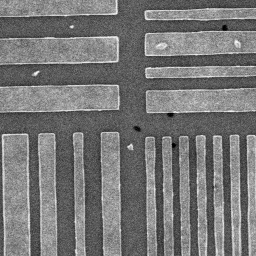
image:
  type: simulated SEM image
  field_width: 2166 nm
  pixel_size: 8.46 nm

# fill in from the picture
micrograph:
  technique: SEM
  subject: groups of lines, slits or small figures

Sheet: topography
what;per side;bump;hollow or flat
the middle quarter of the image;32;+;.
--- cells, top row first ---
................................
.....................+++++++++++
.....................+++++++++++
................................
................................
......+++++++...................
++++++++++++++..................
++++++++++++++.......+++++++++++
++++++++++++++.......+++++++++++
++++++++++++++.......+++++++++++
++++++++++++++.......+++++++++++
+++..................+++++++++++
................................
................................
................................
................................
................................
...++....+++++..................
...++....+++++.......+...+...++.
...++....+++++.......++..++..++.
...++....+++++..+....++..++..++.
...++....+++++.......++..++..++.
...++....+++++.......++..++..++.
...++....+++++.......++..++..++.
...++....+++++.......++..++..++.
...++....+++++.......+...++..++.
...++.....++++.......+...++..++.
...++.....++++.......+...++..++.
...++.....++++.......+...++..++.
...++.....++++.......++..++..++.
...++.....++++.......++..++..++.
...++.....++++.......++..++..++.